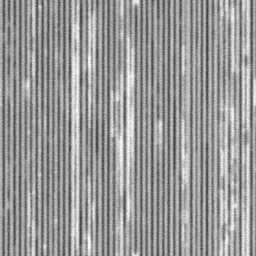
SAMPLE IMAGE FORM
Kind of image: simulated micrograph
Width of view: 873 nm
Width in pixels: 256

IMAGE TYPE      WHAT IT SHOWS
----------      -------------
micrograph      parallel lines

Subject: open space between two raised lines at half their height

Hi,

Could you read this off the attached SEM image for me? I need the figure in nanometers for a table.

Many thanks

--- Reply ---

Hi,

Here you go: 6.4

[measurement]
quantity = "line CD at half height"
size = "12.3 nanometers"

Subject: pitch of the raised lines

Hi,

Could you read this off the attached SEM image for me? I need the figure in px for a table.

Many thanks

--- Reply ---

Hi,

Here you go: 5.48